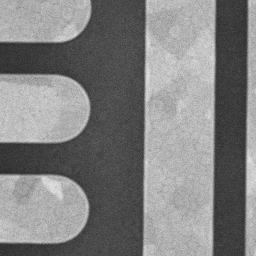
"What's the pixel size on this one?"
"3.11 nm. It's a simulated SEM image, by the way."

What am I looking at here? groups of lines, slits or small figures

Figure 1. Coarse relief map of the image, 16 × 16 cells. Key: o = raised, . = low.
oooooo...oooo...
ooooo....oooo...
oooo.....oooo...
.........oooo...
.........oooo...
ooooo....oooo...
oooooo...oooo..o
ooooo....oooo..o
ooooo....oooo..o
.........oooo..o
.........oooo..o
ooooo....oooo..o
ooooo....oooo..o
ooooo....oooo..o
ooooo....oooo..o
.........oooo..o